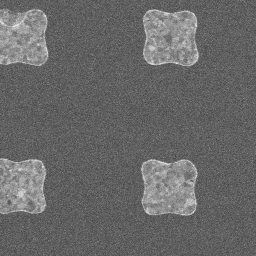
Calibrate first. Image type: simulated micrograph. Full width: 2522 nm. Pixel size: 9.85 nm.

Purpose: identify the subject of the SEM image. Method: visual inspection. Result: raised bodies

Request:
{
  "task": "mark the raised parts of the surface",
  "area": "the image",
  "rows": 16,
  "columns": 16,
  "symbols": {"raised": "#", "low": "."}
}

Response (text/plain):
................
.##......###....
###......###....
###......###....
................
................
................
................
................
................
###......###....
###......###....
###......###....
................
................
................